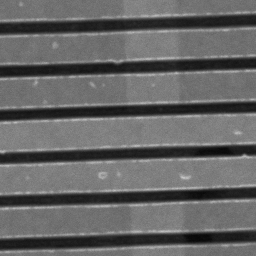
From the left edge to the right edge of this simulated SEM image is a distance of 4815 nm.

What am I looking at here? parallel lines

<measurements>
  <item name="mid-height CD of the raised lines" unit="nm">606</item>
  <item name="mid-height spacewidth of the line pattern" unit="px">11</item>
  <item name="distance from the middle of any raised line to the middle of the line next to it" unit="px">43.1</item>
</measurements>